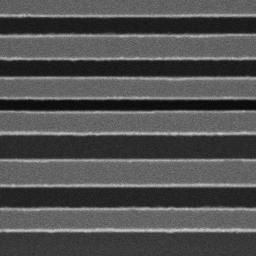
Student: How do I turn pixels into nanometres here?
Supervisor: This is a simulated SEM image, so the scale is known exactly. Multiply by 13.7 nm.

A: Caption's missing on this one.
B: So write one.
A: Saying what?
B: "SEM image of lines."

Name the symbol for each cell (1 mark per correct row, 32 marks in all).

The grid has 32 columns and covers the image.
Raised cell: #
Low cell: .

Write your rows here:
################################
################################
................................
................................
################################
################################
################################
.#.......#......................
................................
................................
################################
################################
................................
................................
################################
################################
################################
................................
................................
................................
################################
################################
################################
................................
................................
................................
################################
################################
################################
................................
................................
................................